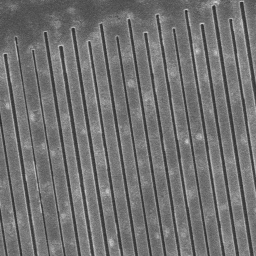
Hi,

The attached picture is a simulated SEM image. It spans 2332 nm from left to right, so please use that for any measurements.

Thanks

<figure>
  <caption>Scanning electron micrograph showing parallel lines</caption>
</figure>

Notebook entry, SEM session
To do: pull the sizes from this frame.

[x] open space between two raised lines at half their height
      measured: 3.47 pixels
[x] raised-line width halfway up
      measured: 11.1 pixels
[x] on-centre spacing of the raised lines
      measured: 0.13 microns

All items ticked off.